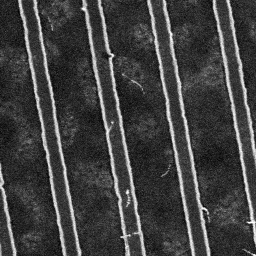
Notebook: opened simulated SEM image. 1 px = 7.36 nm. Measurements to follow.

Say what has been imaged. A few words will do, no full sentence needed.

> parallel lines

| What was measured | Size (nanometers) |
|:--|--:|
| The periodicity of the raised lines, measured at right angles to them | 468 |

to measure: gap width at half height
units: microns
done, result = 0.356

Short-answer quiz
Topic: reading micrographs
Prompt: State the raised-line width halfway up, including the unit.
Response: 116 nanometres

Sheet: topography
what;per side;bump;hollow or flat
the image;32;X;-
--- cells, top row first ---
--XX-------X-------XX------XX---
---XX------XX------XX------XX---
---XX------XX------XX------XX---
---XX------XX------XX------XX---
---XX------XX------XX-------X---
---XX------XX-------X-------XX--
----XX------XX------XX------XX--
----XX------XX------XX------XX--
----XX------XX------XX------XX--
----XX------XX------XX------XX--
----XX------XX------XX------XX--
----XX------XX-------XX------XX-
-----XX------XX------XX------XX-
-----XX------XX------XX------XX-
-----XX------XX------XX------XX-
-----XX------XX------XX------XX-
-----XX------XX------XX-------XX
-----XX-------X-------XX------XX
------XX------XX------XX------XX
------XX------XX------XX------XX
------XX------XX------XX------XX
------XX------XX------XX------XX
------XX------XX-------X-------X
-------X-------XX------XX------X
X------XX------XX------XX------X
X------XX------XX------XX------X
X------XX------XX------XX------X
X------XX------XX------XX------X
X------XX------XX-------XX------
X-------XX-----XXX------XX------
XX------XX------XX------XX------
XX------XX------XX------XX------